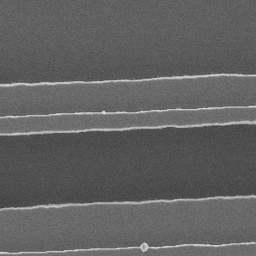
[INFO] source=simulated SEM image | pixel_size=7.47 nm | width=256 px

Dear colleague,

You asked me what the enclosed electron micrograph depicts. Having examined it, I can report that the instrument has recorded lines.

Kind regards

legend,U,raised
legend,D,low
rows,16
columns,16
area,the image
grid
DDDDDDDDDDDDDDDD
DDDDDDDDDDDDDDDD
DDDDDDDDDDDDDDDD
DDDDDDDDDDDDDDDD
DDDDDDDDDDDDDDDD
UUUUUUUUUUUUUUUU
UUUUUUUUUUUUUUUU
UUUUUUUUUUUUUUUU
DDDDDDDDDDDDDDDD
DDDDDDDDDDDDDDDD
DDDDDDDDDDDDDDDD
DDDDDDDDDDDDDDDD
DDDDDDDDDDDDUUUU
UUUUUUUUUUUUUUUU
UUUUUUUUUUUUUUUU
UUUUUUUUUUUUUUUU